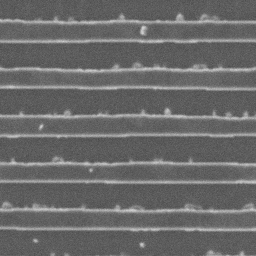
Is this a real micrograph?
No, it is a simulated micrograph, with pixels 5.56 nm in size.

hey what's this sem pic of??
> lines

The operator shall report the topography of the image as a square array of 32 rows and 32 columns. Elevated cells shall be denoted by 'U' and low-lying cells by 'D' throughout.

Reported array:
DDDDDDDDDDDDDDDDDDDDDDDDDDDDDDDD
DDDDDDDDDDDDDDDDDDDDDDDDDDDDDDDD
DDDDDDDDDDDDDDDDDDDDDDDDDDDDDDDD
UUUUUUUUUUUUUUUUUUUUUUUUUUUUUUUU
UUUUUUUUUUUUUUUUUUUUUUUUUUUUUUUU
DDDDDDDDDDDDDDDDDDDDDDDDDDDDDDDD
DDDDDDDDDDDDDDDDDDDDDDDDDDDDDDDD
DDDDDDDDDDDDDDDDDDDDDDDDDDDDDDDD
DDDDDDDDDDDDDDDDDDDDDDDDDDDDDDDD
UUUUUUUUUUUUUUUUUUUUUUUUUUUUUUUU
UUUUUUUUUUUUUUUUUUUUUUUUUUUUUUUU
DDDDDDDDDDDDDDDDDDDDDDDDDDDDDDDD
DDDDDDDDDDDDDDDDDDDDDDDDDDDDDDDD
DDDDDDDDDDDDDDDDDDDDDDDDDDDDDDDD
UUUUUUUUDUUUUUUUUUUUUUUUDUDDDDDD
UUUUUUUUUUUUUUUUUUUUUUUUUUUUUUUU
UUUUUUUUUUUUUUUUUUUUUUUUUUUUUUUU
DDDDDDDDDDDDDDDDDDDDDDDDDDDDDDDD
DDDDDDDDDDDDDDDDDDDDDDDDDDDDDDDD
DDDDDDDDDDDDDDDDDDDDDDDDDDDDDDDD
UUUUUUUUUUUUUUUUUUUUUUUUUUUUUUDD
UUUUUUUUUUUUUUUUUUUUUUUUUUUUUUUU
UUUUUUUUUUUUUUUUUUUUUUUUUUUUUUUU
DDDDDDDDDDDDDDDDDDDDDDDDDDDDDDDD
DDDDDDDDDDDDDDDDDDDDDDDDDDDDDDDD
DDDDDDDDDDDDDDDDDDDDDDDDDDDDDDDD
UUUUUUUUUUUUUUUUUUUUUUUUUUUUUUUU
UUUUUUUUUUUUUUUUUUUUUUUUUUUUUUUU
UUUUUUUUUUUUUUUUUUUUUUUUUUUUUUUU
DDDDDDDDDDDDDDDDDDDDDDDDDDDDDDDD
DDDDDDDDDDDDDDDDDDDDDDDDDDDDDDDD
DDDDDDDDDDDDDDDDDDDDDDDDDDDDDDDD